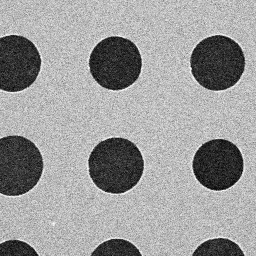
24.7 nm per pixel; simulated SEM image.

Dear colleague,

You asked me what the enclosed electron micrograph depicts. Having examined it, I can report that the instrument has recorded holes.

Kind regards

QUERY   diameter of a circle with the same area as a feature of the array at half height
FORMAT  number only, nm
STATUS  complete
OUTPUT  1350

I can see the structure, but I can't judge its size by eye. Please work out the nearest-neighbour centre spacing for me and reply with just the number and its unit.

2520 nm